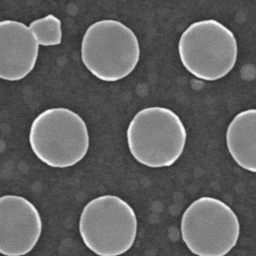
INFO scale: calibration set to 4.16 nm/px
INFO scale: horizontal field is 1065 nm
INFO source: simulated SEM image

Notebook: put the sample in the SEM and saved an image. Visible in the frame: raised bodies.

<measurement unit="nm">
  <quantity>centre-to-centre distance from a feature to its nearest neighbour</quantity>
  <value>406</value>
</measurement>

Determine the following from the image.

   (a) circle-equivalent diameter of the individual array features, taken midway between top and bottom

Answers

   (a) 0.243 um